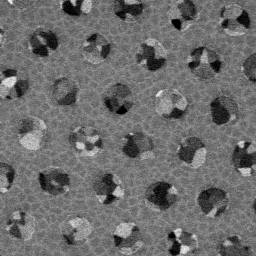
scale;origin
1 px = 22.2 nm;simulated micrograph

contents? a regular array of raised bodies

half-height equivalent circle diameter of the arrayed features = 677 nanometres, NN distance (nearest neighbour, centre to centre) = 1170 nm